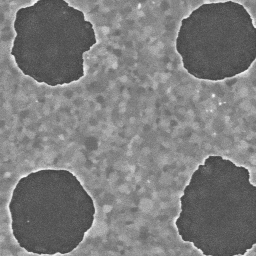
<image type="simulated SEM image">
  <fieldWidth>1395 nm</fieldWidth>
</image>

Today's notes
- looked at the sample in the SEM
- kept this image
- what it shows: holes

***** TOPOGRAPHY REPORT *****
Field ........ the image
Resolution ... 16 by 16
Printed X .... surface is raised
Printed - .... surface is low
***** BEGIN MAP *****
XX---XXXXXXX---X
X-----XXXXX-----
X-----XXXXX-----
X----XXXXXX-----
X----XXXXXXX---X
XXXXXXXXXXXXXXXX
XXXXXXXXXXXXXXXX
XXXXXXXXXXXXXXXX
XXXXXXXXXXXXXXXX
XXXXXXXXXXXXXXXX
XXXXXXXXXXXX---X
X----XXXXXXX----
X-----XXXXX-----
X-----XXXXX-----
X----XXXXXX-----
XX---XXXXXXX----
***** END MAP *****